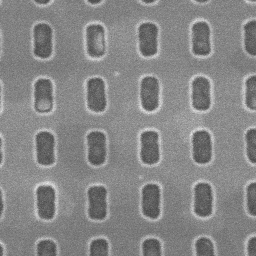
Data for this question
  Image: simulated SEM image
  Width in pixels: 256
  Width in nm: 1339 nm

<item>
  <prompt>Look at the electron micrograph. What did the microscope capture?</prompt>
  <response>a regular array of holes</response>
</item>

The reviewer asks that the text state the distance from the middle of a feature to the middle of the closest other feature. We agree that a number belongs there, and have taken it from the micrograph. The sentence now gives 274 nanometres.